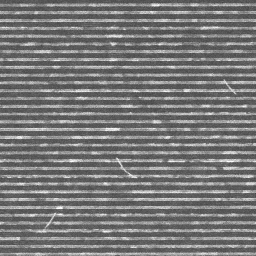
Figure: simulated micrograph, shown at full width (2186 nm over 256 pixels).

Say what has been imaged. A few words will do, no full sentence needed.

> parallel lines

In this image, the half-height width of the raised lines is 21.3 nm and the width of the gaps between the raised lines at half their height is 46.9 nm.